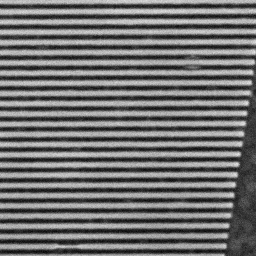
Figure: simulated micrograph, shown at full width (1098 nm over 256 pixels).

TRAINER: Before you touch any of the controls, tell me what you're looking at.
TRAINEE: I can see parallel lines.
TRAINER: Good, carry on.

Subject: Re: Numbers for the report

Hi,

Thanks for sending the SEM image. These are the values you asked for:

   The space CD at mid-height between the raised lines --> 24.6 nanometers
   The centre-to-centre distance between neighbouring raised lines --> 0.0437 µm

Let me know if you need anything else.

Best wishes